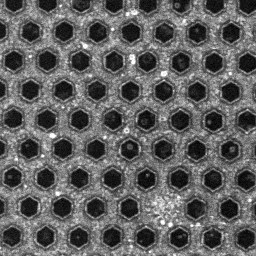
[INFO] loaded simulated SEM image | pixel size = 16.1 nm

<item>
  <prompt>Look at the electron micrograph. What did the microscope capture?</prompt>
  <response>a regular array of raised bodies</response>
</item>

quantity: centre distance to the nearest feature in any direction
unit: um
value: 0.534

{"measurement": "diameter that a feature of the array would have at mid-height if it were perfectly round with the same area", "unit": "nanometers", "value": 329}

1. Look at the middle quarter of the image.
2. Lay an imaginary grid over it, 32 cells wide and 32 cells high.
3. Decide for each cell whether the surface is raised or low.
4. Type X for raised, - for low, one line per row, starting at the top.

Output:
--XXXX----XXXXX----XXXX----XXXX-
---XX------XXX-----XXX------XXX-
--------------------------------
--------------------------------
X------XX-------X-------XX------
XX----XXXX----XXXXX----XXXX----X
XX----XXXX----XXXXX----XXXX----X
XX----XXXX----XXXXX----XXXX----X
XX-----XXX-----XXX-----XXXX----X
----------------X---------------
--------------------------------
---XX-------X-------X-----------
--XXXX----XXXX-----XXXX----XXXX-
--XXXX----XXXXX---XXXXX----XXXX-
--XXXX----XXXXX---XXXXX----XXXX-
--XXXX----XXXX-----XXXX----XXXX-
------------X-------X-------XX--
--------------------------------
--------------------------------
XX-----XXX-----XXX-----XXX------
XX----XXXX----XXXXX----XXXX----X
XX----XXXX----XXXXX----XXXX----X
XX----XXXX----XXXXX----XXXX----X
X------XX------XXX------XX------
--------------------------------
--------------------------------
---XX------XX-------XX------XX--
--XXXX----XXXX-----XXXX----XXXX-
--XXXX----XXXX----XXXXX---XXXXX-
--XXXX----XXXX----XXXXX----XXXX-
--XXX-----XXXX-----XXX-----XXXX-
--------------------------------